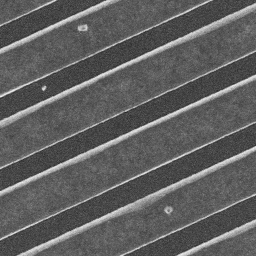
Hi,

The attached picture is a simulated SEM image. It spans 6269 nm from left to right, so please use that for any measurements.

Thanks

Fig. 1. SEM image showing lines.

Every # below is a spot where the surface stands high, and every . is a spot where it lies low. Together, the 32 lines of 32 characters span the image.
######.......############.......
####.......############.......##
##......#############.......####
......#############.......######
....#############.......########
..#############......###########
############.......#############
##########.......#############..
########.......############.....
######.......############.......
###.......#############.......##
#.......#############.......####
......#############......#######
....#############......#########
..############.......###########
############.......############.
##########.......############...
########......#############.....
######......#############.......
###.......#############.......##
#.......#############......#####
......############.......#######
...#############.......#########
.#############.......###########
############.......############.
##########.......############...
########.......############.....
#####.......#############.......
###.......#############.......##
#.......#############.......####
......############........######
....############........########